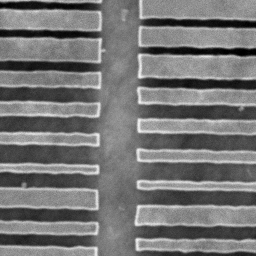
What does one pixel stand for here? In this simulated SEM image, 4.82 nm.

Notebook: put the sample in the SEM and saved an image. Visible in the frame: groups of lines, slits or small figures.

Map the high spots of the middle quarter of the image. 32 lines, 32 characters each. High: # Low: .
...................#############
...................#############
#########..........#############
#########.......................
#########.......................
#########.......................
...................#############
...................#############
...................#############
...................#############
#########.......................
#########.......................
#########.......................
................................
...................#############
...................#############
...................#############
#####...........................
########........................
########........................
................................
...................#............
...................#############
...................#############
................................
######..........................
########........................
................................
................................
...................###.#######..
...................#############
#######.........................